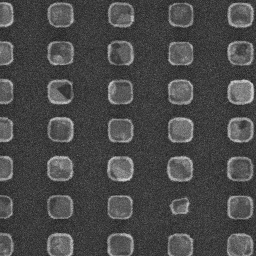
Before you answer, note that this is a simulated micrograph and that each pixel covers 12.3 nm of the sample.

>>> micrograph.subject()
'a regular array of raised bodies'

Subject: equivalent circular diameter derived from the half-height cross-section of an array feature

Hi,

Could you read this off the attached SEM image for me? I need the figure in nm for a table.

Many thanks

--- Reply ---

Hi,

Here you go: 301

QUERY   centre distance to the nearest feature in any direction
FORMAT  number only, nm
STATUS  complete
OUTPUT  470